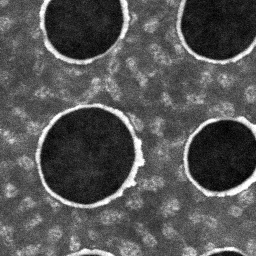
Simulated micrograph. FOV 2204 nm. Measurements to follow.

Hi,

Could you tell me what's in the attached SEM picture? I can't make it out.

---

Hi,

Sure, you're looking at holes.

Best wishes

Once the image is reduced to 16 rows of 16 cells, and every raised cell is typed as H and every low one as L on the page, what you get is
HHHLLLLLHHHLLLLL
HHHLLLLLHHHLLLLL
HHHLLLLHHHHHLLLL
HHHHLLHHHHHHLLLH
HHHHHHHHHHHHHHHH
HHHHHHHHHHHHHHHH
HHHHHHHHHHHHHHHH
HHHHLLLLHHHHHHHH
HHHLLLLLHHHHLLLL
HHLLLLLLHHHHLLLL
HHHLLLLLHHHHLLLL
HHHLLLLLHHHHLLLH
HHHHLLHHHHHHHHHH
HHHHHHHHHHHHHHHH
HHHHHHHHHHHHHHHH
HHHHHHHHHHHHHHHH